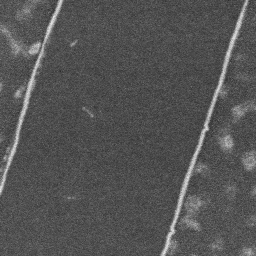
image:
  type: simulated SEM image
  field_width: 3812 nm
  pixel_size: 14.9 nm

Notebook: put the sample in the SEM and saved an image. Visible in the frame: one or a few lines or trenches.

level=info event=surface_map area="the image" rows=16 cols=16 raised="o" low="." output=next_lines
....ooooooooooo.
...oooooooooooo.
...oooooooooooo.
...ooooooooooo..
..oooooooooooo..
..oooooooooooo..
..ooooooooooo...
.oooooooooooo...
.oooooooooooo...
.ooooooooooo....
oooooooooooo....
oooooooooooo....
ooooooooooo.....
ooooooooooo.....
ooooooooooo.....
oooooooooo......